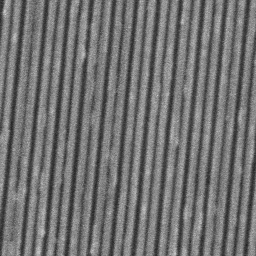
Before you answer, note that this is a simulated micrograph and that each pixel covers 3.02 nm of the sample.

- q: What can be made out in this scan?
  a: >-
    parallel lines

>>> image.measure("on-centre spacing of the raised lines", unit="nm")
33.5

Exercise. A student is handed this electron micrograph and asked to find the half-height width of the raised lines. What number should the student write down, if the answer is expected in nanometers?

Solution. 21.7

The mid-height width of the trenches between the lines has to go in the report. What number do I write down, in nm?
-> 16.1